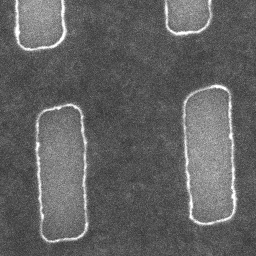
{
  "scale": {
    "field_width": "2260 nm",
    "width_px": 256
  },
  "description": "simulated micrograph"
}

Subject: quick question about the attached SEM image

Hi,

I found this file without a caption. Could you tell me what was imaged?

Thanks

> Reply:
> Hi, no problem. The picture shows holes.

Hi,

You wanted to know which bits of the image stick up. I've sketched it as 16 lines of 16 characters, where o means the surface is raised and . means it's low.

o...oooooo...ooo
o...ooooooo..ooo
o...oooooooooooo
oooooooooooooooo
oooooooooooooooo
ooooooooooooo.oo
oooooooooooo..oo
oo...ooooooo..oo
oo...ooooooo..oo
oo...ooooooo..oo
oo...ooooooo...o
ooo..ooooooo...o
ooo..ooooooo...o
ooo..ooooooo..oo
ooo..ooooooooooo
oooooooooooooooo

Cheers